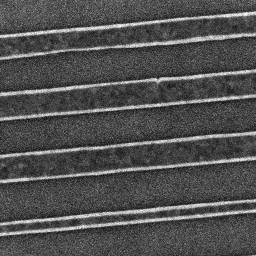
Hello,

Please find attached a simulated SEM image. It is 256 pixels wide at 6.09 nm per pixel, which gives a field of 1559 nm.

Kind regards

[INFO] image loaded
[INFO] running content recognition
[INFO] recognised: one or a few lines or trenches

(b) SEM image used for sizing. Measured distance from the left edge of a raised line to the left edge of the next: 368 nanometers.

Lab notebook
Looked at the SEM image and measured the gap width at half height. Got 224 nm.